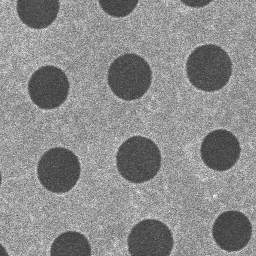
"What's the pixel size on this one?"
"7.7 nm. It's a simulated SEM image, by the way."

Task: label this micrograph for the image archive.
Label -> holes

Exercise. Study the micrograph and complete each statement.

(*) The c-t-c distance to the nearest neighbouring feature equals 619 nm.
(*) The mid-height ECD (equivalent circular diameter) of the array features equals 0.349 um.